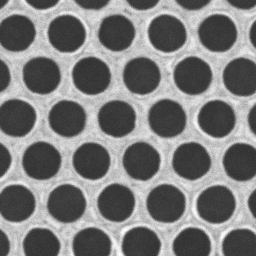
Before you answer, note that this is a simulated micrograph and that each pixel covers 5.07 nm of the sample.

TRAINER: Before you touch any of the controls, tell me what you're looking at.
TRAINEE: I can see a regular array of holes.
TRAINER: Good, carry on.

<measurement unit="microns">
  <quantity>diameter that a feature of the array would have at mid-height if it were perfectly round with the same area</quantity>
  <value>0.195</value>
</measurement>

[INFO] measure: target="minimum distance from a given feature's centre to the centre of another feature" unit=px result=49.1